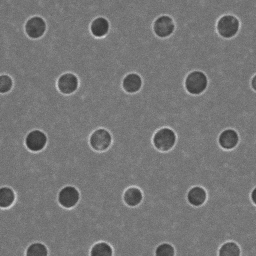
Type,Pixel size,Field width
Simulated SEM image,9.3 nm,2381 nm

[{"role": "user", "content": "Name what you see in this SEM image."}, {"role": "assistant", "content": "a regular array of holes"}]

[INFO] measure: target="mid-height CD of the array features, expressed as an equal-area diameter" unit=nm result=199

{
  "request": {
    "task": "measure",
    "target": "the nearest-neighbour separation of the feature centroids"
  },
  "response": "0.596 um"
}